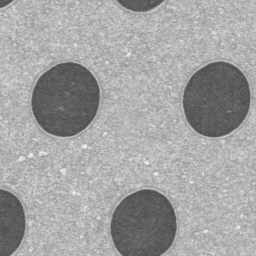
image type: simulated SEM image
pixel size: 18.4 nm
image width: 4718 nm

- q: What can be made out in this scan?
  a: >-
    holes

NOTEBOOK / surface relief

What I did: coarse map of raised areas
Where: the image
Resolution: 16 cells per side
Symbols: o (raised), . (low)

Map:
oooooooo..oooooo
oooooooooooooooo
oooooooooooooooo
oooooooooooooooo
ooo...oooooo...o
oo....oooooo....
oo....ooooo.....
oo....oooooo...o
ooooooooooooo.oo
oooooooooooooooo
oooooooooooooooo
oooooooooooooooo
.ooooooo...ooooo
..ooooo....ooooo
..ooooo....ooooo
.oooooo....ooooo